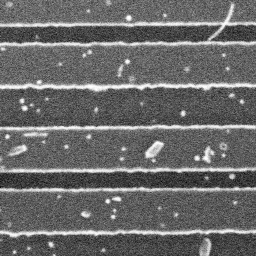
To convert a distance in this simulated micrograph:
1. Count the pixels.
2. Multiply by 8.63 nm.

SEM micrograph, lines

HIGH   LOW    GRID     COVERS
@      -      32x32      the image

@@@@@@@@@@@@@@@@@@@@@@@@@@@@@@@@
@@@@@@@@@@@@@@@@@@@@@@@@@@@@@@@@
@@@@@@@@@@@@@@@@@@@@@@@@@@@@@@@@
--------------------------------
--------------------------------
@@-@@@@@@@-@@@@@@@@@@@@@@@@@@@@@
@@@@@@@@@@@@@@@@@@@@@@@@@@@@@@@@
@@@@@@@@@@@@@@@@@@@@@@@@@@@@@@@@
@@@@@@@@@@@@@@@@@@@@@@@@@@@@@@@@
@@@@@@@@@@@@@@@@@@@@@@@@@@@@@@@@
@@@@@@@@@@@@@@@@@@@@@@@@@@@@@@@@
--------------------------------
--------------------------------
--------------------------------
--------------------------------
--------------------------------
@@@@@@@@@@@@@@@@@@@@@@@@@@@@@@@@
@@@@@@@@@@@@@@@@@@@@@@@@@@@@@@@@
@@@@@@@@@@@@@@@@@@@@@@@@@@@@@@@@
@@@@@@@@@@@@@@@@@@@@@@@@@@@@@@@@
@@@@@@@@@@@@@@@@@@@@@@@@@@@@@@@@
--------------------------------
--------------------------------
--------------------------------
@@@@@@@@@@@@@@@@@@@@@@@@@@@@@@@@
@@@@@@@@@@@@@@@@@@@@@@@@@@@@@@@@
@@@@@@@@@@@@@@@@@@@@@@@@@@@@@@@@
@@@@@@@@@@@@@@@@@@@@@@@@@@@@@@@@
@@@@@@@@@@@@@@@@@@@@@@@@@@@@@@@@
--------------------------------
--------------------------------
--------------------------------